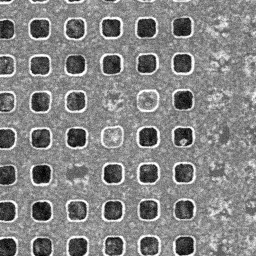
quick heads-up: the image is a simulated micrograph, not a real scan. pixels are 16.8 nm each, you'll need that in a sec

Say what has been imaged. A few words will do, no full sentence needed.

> a regular array of holes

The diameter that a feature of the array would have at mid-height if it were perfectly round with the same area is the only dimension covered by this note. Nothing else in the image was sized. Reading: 352 nm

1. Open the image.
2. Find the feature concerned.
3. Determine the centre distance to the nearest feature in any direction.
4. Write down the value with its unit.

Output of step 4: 594 nm